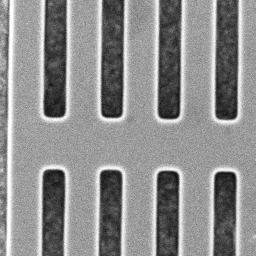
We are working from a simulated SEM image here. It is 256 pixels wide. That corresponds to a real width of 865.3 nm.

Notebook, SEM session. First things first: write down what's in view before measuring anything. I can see groups of lines, slits or small figures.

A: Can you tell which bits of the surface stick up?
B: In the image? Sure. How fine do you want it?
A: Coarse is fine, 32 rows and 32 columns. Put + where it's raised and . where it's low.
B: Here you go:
.+++++..+++++...++++...++++...++
.+++++..+++++...++++...++++...++
.+++++..+++++...++++...++++...++
.+++++..+++++...++++...++++...++
.++++...+++++...++++...++++...++
.++++...+++++...++++...++++...++
.++++...+++++...++++...++++...++
.++++...+++++...++++...++++...++
.++++...+++++...++++...++++...++
.++++...+++++...++++...++++...++
.++++...+++++...++++...++++...++
.++++...+++++...++++...++++...++
.++++...+++++...++++...++++...++
.++++...+++++..+++++...++++...++
.+++++..+++++..+++++..+++++...++
.+++++++++++++++++++++++++++++++
.+++++++++++++++++++++++++++++++
.+++++++++++++++++++++++++++++++
.+++++++++++++++++++++++++++++++
.+++++++++++++++++++++++++++++++
.+++++++++++++++++++++++++++++++
.+++++..+++++..+++++..+++++..+++
.++++...++++...+++++...++++...++
.++++...++++...+++++...++++...++
.++++...++++...+++++..+++++...++
.++++...++++...++++...+++++...++
.++++...++++...++++...+++++...++
.++++...++++...++++...+++++...++
.++++...++++...++++...+++++...++
.++++...++++...++++...+++++...++
.++++...++++...++++...+++++...++
.++++...++++...++++...+++++...++